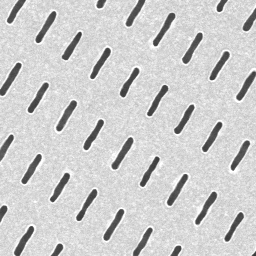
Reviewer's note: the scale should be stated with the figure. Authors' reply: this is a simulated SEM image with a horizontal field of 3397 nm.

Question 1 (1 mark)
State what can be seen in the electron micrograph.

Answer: a regular array of holes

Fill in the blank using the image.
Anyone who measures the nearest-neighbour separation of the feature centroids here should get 439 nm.